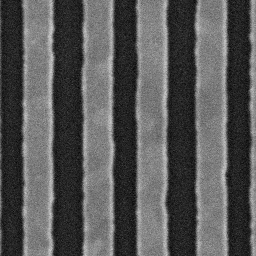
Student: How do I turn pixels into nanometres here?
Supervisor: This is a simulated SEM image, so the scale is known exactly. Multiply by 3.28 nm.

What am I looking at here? lines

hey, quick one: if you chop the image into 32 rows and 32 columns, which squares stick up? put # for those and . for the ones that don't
...####...####...####....###...#
...####....###...####....###...#
...####...####...####....###...#
...####...####...####....###...#
...###....####...####....###...#
...###....####...####....###...#
...####...####...####...####...#
...####....###...####....###...#
...####...####...####....###...#
...####...####...####....###...#
...###....####...####....###...#
...###....####...####....###...#
...###....####...####....###...#
...###....####...####....###...#
...###....####...####....###...#
...####....###...####....###...#
...####...####...####....###...#
...####...####...####....###....
...###....####...####....###...#
...###....####...####....###...#
...####...####...####....###...#
...####....###...####....###...#
...####...####...####....###...#
...####...####...####....###...#
...####....###...####....###...#
...###....####...####....###...#
...###....####...####....###...#
...###.....###...####....###...#
...###.....###...####....###...#
...###.....###...####....###...#
...####...####...####....###...#
...####...####...####....###....